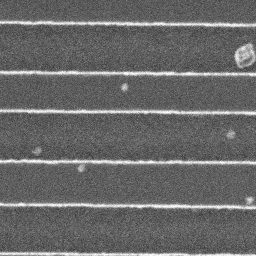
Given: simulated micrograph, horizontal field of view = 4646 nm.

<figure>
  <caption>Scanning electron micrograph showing lines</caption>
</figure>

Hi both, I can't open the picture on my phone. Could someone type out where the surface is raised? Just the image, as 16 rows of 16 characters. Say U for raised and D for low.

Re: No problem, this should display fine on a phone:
UUUUUUUUUUUUUUUU
DDDDDDDDDDDUUUUU
DDDDDDDDDDDDDDDD
DDDDDDDDDDDDDDDD
DDDDDDDDDDDDDDDD
UUUUUUUUUUUUUUUU
UUUUUUUUUUUUUUUU
DDDDDDDDDDDDDDDD
DDDDDDDDDDDDDDDD
DDDDDDDDDDDDDDDD
UUUUUUUUUUUUUUUU
UUUUUUUUUUUUUUUU
UUUUUUUUUUUUUUUU
DDDDDDDDDDDDDDDD
DDDDDDDDDDDDDDDD
DDDDDDDDDDDDDDDD